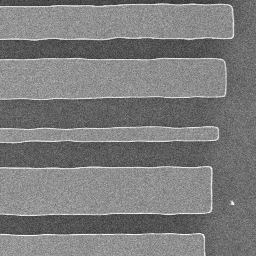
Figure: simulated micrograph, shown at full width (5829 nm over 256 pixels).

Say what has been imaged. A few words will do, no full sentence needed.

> groups of lines, slits or small figures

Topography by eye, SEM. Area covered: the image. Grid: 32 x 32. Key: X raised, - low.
--------------------------------
XXXXXXXXXXXXXXXXXXXXXXXXXXXXX---
XXXXXXXXXXXXXXXXXXXXXXXXXXXXX---
XXXXXXXXXXXXXXXXXXXXXXXXXXXXX---
XXXXXXXXXXXXXXXXXXXXXXXXXXXXX---
--------------------------------
--------------------------------
XXXXXXXXXXXXXXXXXXXXXXXXXXXX----
XXXXXXXXXXXXXXXXXXXXXXXXXXXX----
XXXXXXXXXXXXXXXXXXXXXXXXXXXX----
XXXXXXXXXXXXXXXXXXXXXXXXXXXX----
XXXXXXXXXXXXXXXXXXXXXXXXXXXX----
--------------------------------
--------------------------------
--------------------------------
--------------------------------
XXXXXXXXXXXXXXXXXXXXXXXXXXX-----
XXXXXXXXXXXXXXXXXXXXXXXXXXX-----
--------------------------------
--------------------------------
--------------------------------
XXXXXXXXXXXXXXXXXXXXXXXXXX------
XXXXXXXXXXXXXXXXXXXXXXXXXX------
XXXXXXXXXXXXXXXXXXXXXXXXXX------
XXXXXXXXXXXXXXXXXXXXXXXXXX------
XXXXXXXXXXXXXXXXXXXXXXXXXX------
XXXXXXXXXXXXXXXXXXXXXXXXXX------
--------------------------------
--------------------------------
XXXXXXXXXXXXXXXXXXXXXXXXX-------
XXXXXXXXXXXXXXXXXXXXXXXXXX------
XXXXXXXXXXXXXXXXXXXXXXXXXX------